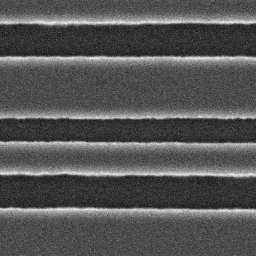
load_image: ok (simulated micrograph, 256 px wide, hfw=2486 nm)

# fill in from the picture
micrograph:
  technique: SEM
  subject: lines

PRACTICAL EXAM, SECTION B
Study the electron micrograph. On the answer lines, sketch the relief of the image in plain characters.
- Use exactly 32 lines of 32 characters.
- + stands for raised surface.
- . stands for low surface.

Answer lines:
++++++++++++++++++++++++++++++++
++++++++++++++++++++++++++++++++
++++++++++++++++++++++++++++++++
................................
................................
................................
................................
++++++++++++++++++++++++++++++++
++++++++++++++++++++++++++++++++
++++++++++++++++++++++++++++++++
++++++++++++++++++++++++++++++++
++++++++++++++++++++++++++++++++
++++++++++++++++++++++++++++++++
++++++++++++++++++++++++++++++++
++++++++++++++++++++++++++++++++
................................
................................
................................
++++++++++++++++++++++++++++++++
++++++++++++++++++++++++++++++++
++++++++++++++++++++++++++++++++
++++++++++++++++++++++++++++++++
................................
................................
................................
................................
++++++++++++++++++++++++++++++++
++++++++++++++++++++++++++++++++
++++++++++++++++++++++++++++++++
++++++++++++++++++++++++++++++++
++++++++++++++++++++++++++++++++
++++++++++++++++++++++++++++++++